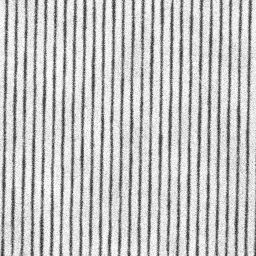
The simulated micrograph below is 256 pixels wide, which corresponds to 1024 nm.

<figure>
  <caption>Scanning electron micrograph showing parallel lines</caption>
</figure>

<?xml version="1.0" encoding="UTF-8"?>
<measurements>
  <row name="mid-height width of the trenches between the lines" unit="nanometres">13.5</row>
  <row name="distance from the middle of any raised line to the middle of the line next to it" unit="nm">38.9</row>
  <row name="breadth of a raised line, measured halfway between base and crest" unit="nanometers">27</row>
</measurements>